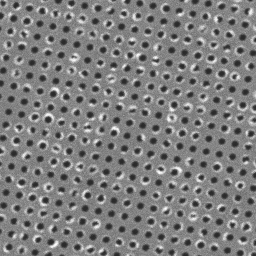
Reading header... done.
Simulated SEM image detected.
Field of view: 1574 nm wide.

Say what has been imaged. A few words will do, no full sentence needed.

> a regular array of holes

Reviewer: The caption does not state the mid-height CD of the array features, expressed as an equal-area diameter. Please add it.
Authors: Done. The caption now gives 42.2 nanometres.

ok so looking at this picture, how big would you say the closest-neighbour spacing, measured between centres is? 12.9 pixels